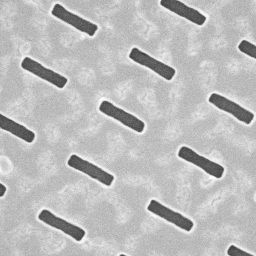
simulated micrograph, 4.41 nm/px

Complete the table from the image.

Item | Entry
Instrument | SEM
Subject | a regular array of holes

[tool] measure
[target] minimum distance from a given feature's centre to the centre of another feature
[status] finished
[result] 272 nanometers